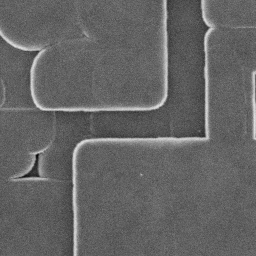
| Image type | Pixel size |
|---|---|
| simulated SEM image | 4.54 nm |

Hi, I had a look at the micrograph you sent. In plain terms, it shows wiring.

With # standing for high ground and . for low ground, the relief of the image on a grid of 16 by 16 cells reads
##########...###
##########...###
##########...###
..########...###
..########...###
..########...###
..########...###
.............###
.............###
.....###########
.....###########
.....###########
.....###########
.....###########
.....###########
.....###########